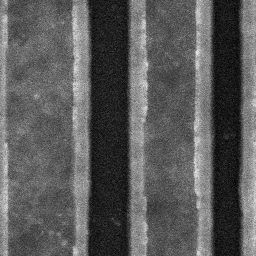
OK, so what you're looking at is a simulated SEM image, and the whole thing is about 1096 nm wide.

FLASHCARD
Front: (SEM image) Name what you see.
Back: one or a few lines or trenches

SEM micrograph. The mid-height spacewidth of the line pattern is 0.219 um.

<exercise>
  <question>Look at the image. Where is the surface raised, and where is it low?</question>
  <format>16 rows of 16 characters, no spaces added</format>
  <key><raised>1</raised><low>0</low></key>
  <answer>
1111100001111000
1111100001111000
1111100001111000
1111100001111000
1111100001111000
1111100001111000
1111100001111000
1111100001111000
1111100001111000
1111100001111000
1111100001111000
1111100001111000
1111100001111000
1111100001111000
1111100001111000
1111100001111000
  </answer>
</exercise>